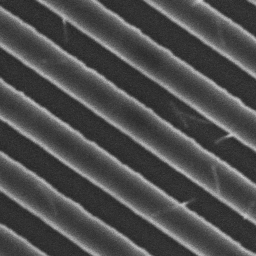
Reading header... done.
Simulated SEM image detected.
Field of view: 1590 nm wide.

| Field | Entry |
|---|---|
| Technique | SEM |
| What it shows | lines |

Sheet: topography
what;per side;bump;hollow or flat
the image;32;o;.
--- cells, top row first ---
.....ooooooo.......ooooooo......
o......ooooooo......ooooooo.....
oo......ooooooo.......ooooooo...
oooo......ooooooo......ooooooo..
ooooo......ooooooo......ooooooo.
ooooooo......oooooo.......oooooo
.ooooooo......ooooooo......ooooo
...ooooooo.....ooooooo.......ooo
....ooooooo......ooooooo......oo
.....oooooooo.....ooooooo.......
o......ooooooo......ooooooo.....
oo......ooooooo......ooooooo....
oooo......ooooooo......ooooooo..
ooooo......ooooooo......ooooooo.
ooooooo.....oooooooo......oooooo
.ooooooo......ooooooo......ooooo
..oooooooo.....ooooooo......oooo
....ooooooo......ooooooo......oo
.....ooooooo......ooooooo......o
o......ooooooo......ooooooo.....
oo......ooooooo......ooooooo....
oooo......ooooooo.....oooooooo..
ooooo......ooooooo......ooooooo.
ooooooo......ooooooo.....ooooooo
.ooooooo......ooooooo......ooooo
..oooooooo.....oooooooo.....oooo
....ooooooo......ooooooo......oo
.....ooooooo......ooooooo......o
o......ooooooo......ooooooo.....
oo......ooooooo......ooooooo....
oooo......ooooooo......ooooooo..
ooooo......ooooooo......ooooooo.